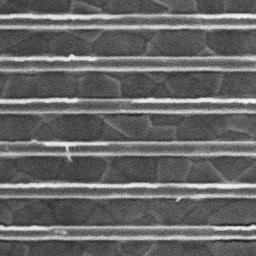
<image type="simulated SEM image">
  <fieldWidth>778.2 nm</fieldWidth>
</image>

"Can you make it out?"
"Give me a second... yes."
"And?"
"parallel lines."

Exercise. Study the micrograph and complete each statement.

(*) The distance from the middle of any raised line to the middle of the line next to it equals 128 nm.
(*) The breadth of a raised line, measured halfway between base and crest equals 39.6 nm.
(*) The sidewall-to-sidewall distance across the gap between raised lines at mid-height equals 87.1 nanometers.